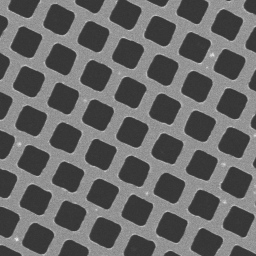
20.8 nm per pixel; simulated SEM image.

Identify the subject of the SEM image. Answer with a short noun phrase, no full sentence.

a regular array of holes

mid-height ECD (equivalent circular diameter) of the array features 29.4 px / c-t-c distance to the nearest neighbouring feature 798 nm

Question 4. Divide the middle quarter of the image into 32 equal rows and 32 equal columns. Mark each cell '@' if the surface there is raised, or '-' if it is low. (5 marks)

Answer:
--@@@------@@@@---@@@--------@@@
--@@@-------@@@@@@@@@-------@@@@
-@@@--------@@@@@@@@@-------@@@-
@@@@-------@@@@--@@@@------@@@@-
@@@@-------@@@-----@@@@----@@@--
-@@@@------@@@------@@@@@-@@@@--
---@@@@---@@@--------@@@@@@@@---
----@@@@@@@@@-------@@@@-@@@@@--
----@@@@@@@@@-------@@@----@@@@-
---@@@---@@@@@-----@@@-------@@@
---@@@-----@@@@@---@@@-------@@@
--@@@-------@@@@@@@@@--------@@@
-@@@@-------@@@@@@@@@-------@@@@
@@@@@-------@@@---@@@@------@@@-
@@@@@------@@@@-----@@@@---@@@@-
--@@@@-----@@@-------@@@@@@@@@--
----@@@@--@@@@-------@@@@@@@@@--
-----@@@@@@@@--------@@@--@@@@@-
----@@@@@@@@@-------@@@@----@@@@
----@@@---@@@@------@@@-------@@
---@@@------@@@@---@@@--------@@
---@@@-------@@@@@@@@@-------@@@
@@@@@--------@@@@@@@@@-------@@@
@@@@@-------@@@@--@@@@@-----@@@@
-@@@@@------@@@------@@@@---@@@-
---@@@@----@@@@------@@@@@@@@@@-
-----@@@@@-@@@-------@@@@@@@@@--
-----@@@@@@@@@-------@@@@--@@@@-
-----@@@@@@@@@-------@@@-----@@@
----@@@----@@@@-----@@@-------@@
----@@@------@@@@@-@@@@-------@@
@--@@@--------@@@@@@@@--------@@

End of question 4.